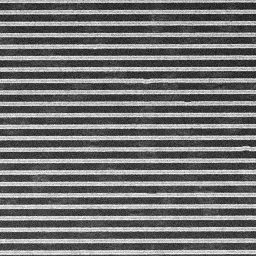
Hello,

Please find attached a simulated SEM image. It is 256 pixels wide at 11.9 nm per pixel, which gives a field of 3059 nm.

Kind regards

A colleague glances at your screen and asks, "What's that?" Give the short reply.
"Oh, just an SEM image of parallel lines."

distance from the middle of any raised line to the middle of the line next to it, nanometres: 137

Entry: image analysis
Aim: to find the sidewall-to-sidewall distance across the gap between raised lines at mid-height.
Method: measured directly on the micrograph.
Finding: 103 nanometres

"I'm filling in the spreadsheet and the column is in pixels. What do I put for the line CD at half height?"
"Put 2.88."